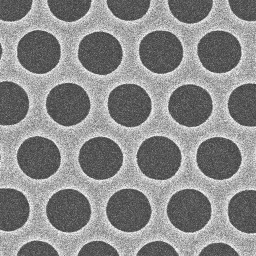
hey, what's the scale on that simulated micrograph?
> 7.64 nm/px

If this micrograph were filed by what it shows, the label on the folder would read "a regular array of holes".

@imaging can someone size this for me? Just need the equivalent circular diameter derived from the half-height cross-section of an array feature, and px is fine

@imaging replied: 44.2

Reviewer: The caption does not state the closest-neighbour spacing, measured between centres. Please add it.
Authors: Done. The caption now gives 456 nm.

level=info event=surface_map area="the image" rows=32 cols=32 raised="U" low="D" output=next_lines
DDDDUUDDDDDUUDDDDDDUUDDDDDDUUDDD
DDDDUUDDDDDUUUDDDDUUUDDDDDUUUDDD
DDUUUUUUDDUUUUUDDUUUUUDDDUUUUUUD
UUUUUUUUUUUUUUUUUUUUUUUUUUUUUUUU
UUUDDDDUUUUDDDUUUUDDDDUUUUDDDUUU
UUDDDDDUUUDDDDDUUDDDDDDUUDDDDDUU
UUDDDDDDUUDDDDDUUDDDDDDUUDDDDDUU
UUDDDDDUUUDDDDDUUUDDDDDUUDDDDDUU
UUUDDDDUUUUDDDDUUUDDDDUUUUDDDUUU
UUUUUUUUUUUUUUUUUUUUUUUUUUUUUUUU
DDUUUUUUDDUUUUUDDUUUUUUUUUUUUUUD
DDDUUUDDDDDUUUDDDDUUUUDDDDUUUDDD
DDDDUUDDDDDUUUDDDDDUUDDDDDUUUDDD
DDDDUUDDDDDUUUDDDDDUUDDDDDDUDDDD
DDDUUUDDDDDUUUDDDDDUUDDDDDUUUDDD
DDUUUUUDDDUUUUUDDDUUUUUDDUUUUUDD
UUUUUUUUUUUUUUUUUUUUUUUUUUUUUUUU
UUUDDDUUUUUDDDUUUUDDDUUUUUDDDUUU
UUDDDDDUUUDDDDDUUDDDDDUUUDDDDDUU
UUDDDDDDUUDDDDDUUDDDDDDUDDDDDDUU
UUDDDDDDUUDDDDDUUDDDDDDUUDDDDDUU
UUUDDDDUUUDDDDDUUUDDDDUUUDDDDDUU
UUUUUUUUUUUUDUUUUUUUUUUUUUUDUUUU
DUUUUUUUUUUUUUUUUUUUUUUUUUUUUUUU
DDDUUUDDDDDUUUDDDDUUUUDDDDUUUDDD
DDDDUUDDDDDUUDDDDDDUUDDDDDUUUDDD
DDDDUUDDDDDUUDDDDDDUUDDDDDDUDDDD
DDDUUUDDDDDUUUDDDDDUUDDDDDUUUDDD
DDUUUUUDDDUUUUUDDDUUUUDDDUUUUDDD
UUUUUUUUUUUUUUUUUUUUUUUUUUUUUUUU
UUUDDDUUUUUDDDUUUUDDDUUUUUDDUUUU
UUDDDDDUUUDDDDDUUDDDDDUUUDDDDDUU